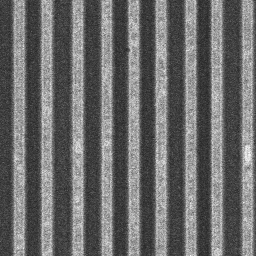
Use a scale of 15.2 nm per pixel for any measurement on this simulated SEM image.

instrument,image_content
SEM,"parallel lines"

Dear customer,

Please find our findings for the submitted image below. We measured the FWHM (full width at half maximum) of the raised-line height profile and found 192 nm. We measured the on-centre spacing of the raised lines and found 0.434 micrometres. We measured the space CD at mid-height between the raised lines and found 0.243 micrometres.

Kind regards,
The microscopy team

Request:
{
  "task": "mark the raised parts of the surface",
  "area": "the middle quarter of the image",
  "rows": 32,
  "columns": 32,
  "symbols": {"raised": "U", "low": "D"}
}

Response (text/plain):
DDUUUDDDDUUUDDDDUUUDDDDUUUDDDDUU
DDUUUDDDDUUUDDDDUUUDDDDUUUDDDDUU
DDUUUDDDDUUUDDDDUUUDDDDUUUDDDDUU
DDUUUDDDDUUUDDDDUUUDDDDUUUDDDDUU
DDUUUDDDDUUUDDDDUUUDDDDUUUDDDDUU
DDUUUDDDDUUUDDDDUUUDDDDUUUDDDDUU
DDUUUDDDDUUUDDDDUUUDDDDUUUDDDDUU
DDUUUDDDDUUUDDDDUUUDDDDUUUDDDDUU
DDUUUDDDDUUUDDDDUUUDDDDUUUDDDDUU
DDUUUDDDDUUUDDDDUUUDDDDUUUDDDDUU
DDUUUDDDDUUUDDDDUUUDDDDUUUDDDDUU
DDUUUDDDDUUUDDDDUUUDDDDUUUDDDDUU
DDUUUDDDDUUUDDDDUUUDDDDUUUDDDDUU
DDUUUDDDDUUUDDDDUUUDDDDUUUDDDDUU
DDUUUDDDDUUUDDDDUUUDDDDUUUDDDDUU
DDUUUDDDDUUUDDDDUUUDDDDUUUDDDDUU
DDUUUDDDDUUUDDDDUUUDDDDUUUDDDDUU
DDUUUDDDDUUUDDDDUUUDDDDUUUDDDDUU
DDUUUDDDDUUUDDDDUUUDDDDUUUDDDDUU
DDUUUDDDDUUUDDDDUUUDDDDUUUDDDDUU
DDUUUDDDDUUUDDDDUUUDDDDUUUDDDDUU
DDUUUDDDDUUUDDDDUUUDDDDUUUDDDDUU
DDUUUDDDDUUUDDDDUUUDDDDUUUDDDDUU
DDUUUDDDDUUUDDDDUUUDDDDUUUDDDDUU
DDUUUDDDDUUUDDDDUUUDDDDUUUDDDDUU
DDUUUDDDDUUUDDDDUUUDDDDUUUDDDDUU
DDUUUDDDDUUUDDDDUUUDDDDUUUDDDDUU
DDUUUDDDDUUUDDDDUUUDDDDUUUDDDDUU
DDUUUDDDDUUUDDDDUUUDDDDUUUDDDDUU
DDUUUDDDDUUUDDDDUUUDDDDUUUDDDDUU
DDUUUDDDDUUUDDDDUUUDDDDUUUDDDDUU
DDUUUDDDDUUUDDDDUUUDDDDUUUDDDDUU